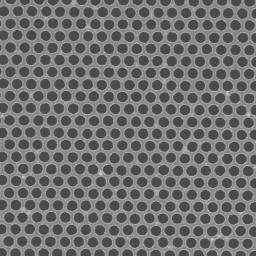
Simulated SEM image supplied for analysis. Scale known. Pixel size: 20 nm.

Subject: a regular array of holes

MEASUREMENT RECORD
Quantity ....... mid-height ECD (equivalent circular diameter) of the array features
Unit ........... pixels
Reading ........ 10.6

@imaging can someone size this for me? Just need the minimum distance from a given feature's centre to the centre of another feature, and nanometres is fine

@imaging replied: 272